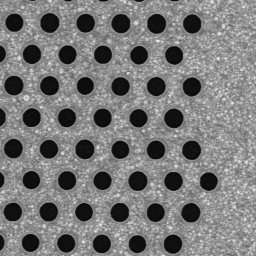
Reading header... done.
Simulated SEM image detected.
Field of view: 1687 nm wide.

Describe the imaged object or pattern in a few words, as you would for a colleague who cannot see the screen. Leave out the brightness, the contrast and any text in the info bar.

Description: a regular array of holes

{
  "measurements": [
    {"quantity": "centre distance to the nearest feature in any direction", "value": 234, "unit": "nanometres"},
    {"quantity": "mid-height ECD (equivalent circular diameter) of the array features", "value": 124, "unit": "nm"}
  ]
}